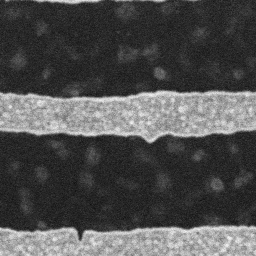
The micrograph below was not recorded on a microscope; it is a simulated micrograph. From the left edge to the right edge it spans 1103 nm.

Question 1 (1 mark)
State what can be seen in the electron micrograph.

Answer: one or a few lines or trenches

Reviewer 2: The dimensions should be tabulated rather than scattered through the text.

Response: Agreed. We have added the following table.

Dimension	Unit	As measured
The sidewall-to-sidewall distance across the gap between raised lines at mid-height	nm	415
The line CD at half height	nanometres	160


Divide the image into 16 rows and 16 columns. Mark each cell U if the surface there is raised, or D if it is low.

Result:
DDDDDDDDDDDDDDDD
DDDDDDDDDDDDDDDD
DDDDDDDDDDDDDDDD
DDDDDDDDDDDDDDDD
DDDDDDDDDDDDDDDD
DDDDDDDDDDDDDDDD
UUUUUUUUUUUUUUUU
UUUUUUUUUUUUUUUU
DDDDDDDDDUDDDDDD
DDDDDDDDDDDDDDDD
DDDDDDDDDDDDDDDD
DDDDDDDDDDDDDDDD
DDDDDDDDDDDDDDDD
DDDDDDDDDDDDDDDD
UDDUUDDDUUUUUUUU
UUUUUUUUUUUUUUUU